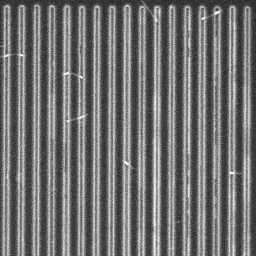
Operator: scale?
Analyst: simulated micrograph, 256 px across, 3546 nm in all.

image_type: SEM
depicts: parallel lines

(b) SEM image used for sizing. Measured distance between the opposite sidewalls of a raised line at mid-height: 166 nanometres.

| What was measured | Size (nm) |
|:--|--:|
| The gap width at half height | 50.2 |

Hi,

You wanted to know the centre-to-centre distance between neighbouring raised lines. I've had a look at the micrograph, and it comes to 208 nanometres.